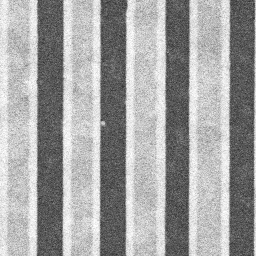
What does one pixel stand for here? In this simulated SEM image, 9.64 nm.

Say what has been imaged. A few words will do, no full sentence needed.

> one or a few lines or trenches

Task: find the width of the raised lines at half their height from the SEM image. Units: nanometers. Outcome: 296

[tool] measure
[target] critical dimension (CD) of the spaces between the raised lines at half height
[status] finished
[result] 320 nm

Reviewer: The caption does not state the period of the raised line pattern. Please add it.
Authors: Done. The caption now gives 613 nanometres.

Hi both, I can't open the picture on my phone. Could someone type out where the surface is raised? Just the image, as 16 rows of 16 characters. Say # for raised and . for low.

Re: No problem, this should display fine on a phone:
##..##..##..##..
##..##..##..##..
##..##..##..##..
##..##..##..##..
##..##..##..##..
##..##..##..##..
##..##..##..##..
##..##..##..##..
##..##..##..##..
##..##..##..##..
##..##..##..##..
##..##..##..##..
##..##..##..##..
##..##..##..##..
##..##..##..##..
##..##..##..##..